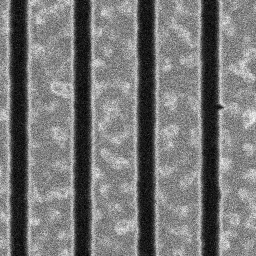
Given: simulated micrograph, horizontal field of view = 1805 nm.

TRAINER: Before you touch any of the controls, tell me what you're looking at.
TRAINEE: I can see parallel lines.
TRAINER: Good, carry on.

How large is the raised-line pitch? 448 nm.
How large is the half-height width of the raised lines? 329 nanometres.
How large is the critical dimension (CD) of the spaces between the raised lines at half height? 117 nanometres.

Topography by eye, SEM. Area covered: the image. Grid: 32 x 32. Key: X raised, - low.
X---XXXXX--XXXXXX--XXXXXX--XXXXX
X---XXXXX--XXXXXX--XXXXXX--XXXXX
X--XXXXXX--XXXXXX--XXXXXX--XXXXX
X--XXXXXX--XXXXXX--XXXXXX--XXXXX
X---XXXXX--XXXXXX--XXXXXX--XXXXX
X---XXXXX--XXXXXX--XXXXXX--XXXXX
X---XXXXX--XXXXXX--XXXXXX--XXXXX
X--XXXXXX--XXXXXX--XXXXXX--XXXXX
X--XXXXXX--XXXXXX--XXXXXX--XXXXX
X--XXXXXX--XXXXXX--XXXXXX--XXXXX
X--XXXXXX--XXXXXX--XXXXXX--XXXXX
X--XXXXXX--XXXXXX--XXXXXX--XXXXX
X---XXXXX--XXXXXX--XXXXXX--XXXXX
X---XXXXX--XXXXXX--XXXXXX---XXXX
X--XXXXXX--XXXXXX--XXXXXX--XXXXX
X--XXXXXX--XXXXXX--XXXXXX--XXXXX
X--XXXXXX--XXXXXX--XXXXXX--XXXXX
X---XXXXX--XXXXXX--XXXXXX--XXXXX
X---XXXXX--XXXXXX--XXXXXX--XXXXX
X--XXXXXX--XXXXXX--XXXXXX--XXXXX
X---XXXXX--XXXXXX--XXXXXX--XXXXX
X--XXXXXX--XXXXXX--XXXXXX--XXXXX
X--XXXXXX--XXXXXX--XXXXXX--XXXXX
X---XXXXX--XXXXXX--XXXXXX--XXXXX
X--XXXXXX--XXXXXX--XXXXXX---XXXX
X--XXXXXX--XXXXXX--XXXXXX--XXXXX
X--XXXXXX--XXXXXX--XXXXXX--XXXXX
X--XXXXXX--XXXXXX--XXXXXX--XXXXX
X--XXXXXX--XXXXXX--XXXXXX--XXXXX
X--XXXXXX--XXXXXX--XXXXXX--XXXXX
X--XXXXXX--XXXXXX--XXXXXX--XXXXX
X--XXXXXX--XXXXXX--XXXXXX--XXXXX